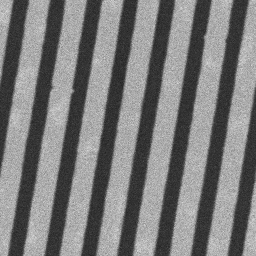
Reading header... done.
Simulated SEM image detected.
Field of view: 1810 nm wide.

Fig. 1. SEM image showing parallel lines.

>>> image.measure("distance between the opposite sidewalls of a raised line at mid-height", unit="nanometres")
149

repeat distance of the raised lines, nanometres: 255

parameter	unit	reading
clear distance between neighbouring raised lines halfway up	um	0.105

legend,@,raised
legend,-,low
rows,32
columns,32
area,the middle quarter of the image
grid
@@@----@@@@@----@@@@@----@@@@@--
@@@----@@@@@----@@@@@----@@@@@--
@@@----@@@@@---@@@@@@----@@@@@--
@@@---@@@@@@---@@@@@@----@@@@@--
@@----@@@@@----@@@@@@----@@@@@--
@@----@@@@@----@@@@@----@@@@@@--
@@----@@@@@----@@@@@----@@@@@---
@@----@@@@@----@@@@@----@@@@@---
@@----@@@@@---@@@@@@----@@@@@---
@@---@@@@@@---@@@@@@---@@@@@@---
@----@@@@@----@@@@@@---@@@@@@---
@----@@@@@----@@@@@----@@@@@@---
@----@@@@@----@@@@@----@@@@@----
@----@@@@@----@@@@@----@@@@@----
@----@@@@@---@@@@@@----@@@@@----
@---@@@@@@---@@@@@@---@@@@@@----
----@@@@@@---@@@@@@---@@@@@@---@
----@@@@@----@@@@@----@@@@@@---@
----@@@@@----@@@@@----@@@@@----@
----@@@@@----@@@@@----@@@@@----@
---@@@@@@---@@@@@@----@@@@@----@
---@@@@@@---@@@@@@---@@@@@@----@
---@@@@@----@@@@@@---@@@@@@----@
---@@@@@----@@@@@----@@@@@@---@@
---@@@@@----@@@@@----@@@@@----@@
---@@@@@----@@@@@----@@@@@----@@
---@@@@@----@@@@@----@@@@@----@@
--@@@@@@----@@@@@----@@@@@----@@
--@@@@@----@@@@@@----@@@@@----@@
--@@@@@----@@@@@----@@@@@@---@@@
--@@@@@----@@@@@----@@@@@----@@@
--@@@@@----@@@@@----@@@@@----@@@